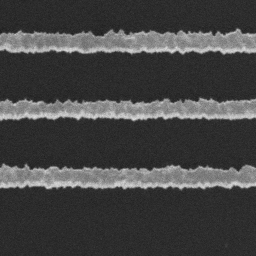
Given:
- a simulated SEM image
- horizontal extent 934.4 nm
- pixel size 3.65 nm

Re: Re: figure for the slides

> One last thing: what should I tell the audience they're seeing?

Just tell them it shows lines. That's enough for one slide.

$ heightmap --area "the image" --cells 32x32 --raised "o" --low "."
................................
................................
................................
................................
oooooooooooo.ooooooooooooooooooo
oooooooooooooooooooooooooooooooo
..........o.....o...........o..o
................................
................................
................................
................................
................................
....................o....oo.....
oooooooooooooooooooooooooooooooo
oooooooo.ooooooooooooooooooooooo
................................
................................
................................
................................
................................
................................
oooooooooooooooooooooooooooooooo
oooooooooooooooooooooooooooooooo
................................
................................
................................
................................
................................
................................
................................
................................
................................